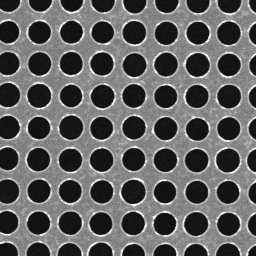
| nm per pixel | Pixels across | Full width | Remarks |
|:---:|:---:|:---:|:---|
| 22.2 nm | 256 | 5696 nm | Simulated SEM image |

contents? a regular array of holes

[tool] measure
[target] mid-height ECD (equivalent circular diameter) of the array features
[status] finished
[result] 524 nanometres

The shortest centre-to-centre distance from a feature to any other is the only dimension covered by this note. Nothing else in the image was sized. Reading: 696 nm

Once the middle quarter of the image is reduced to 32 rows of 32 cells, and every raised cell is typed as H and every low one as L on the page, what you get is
LLLLLHHLLLLLHHLLLLLLLHLLLLLLHHLL
LLLLHHHLLLLLHHHLLLLLHHHLLLLLHHHL
LLLHHHHHLLLHHHHHLLLLHHHHLLLLHHHL
HHHHHHHHHHHHHHHHHHHHHHHHHHHHHHHH
HHHHHHHHHHHHHHHHHHHHHHHHHHHHHHHH
LLLHHHHHLLLHHHHHLLLHHHHHHLHHHHHH
LLLLHHHLLLLLHHHLLLLLHHHLLLLLHHHL
LLLLLHHLLLLLLHHLLLLLHHHLLLLLHHLL
LLLLLHHLLLLLLHHLLLLLHHHLLLLLHHLL
LLLLHHHLLLLLHHHLLLLLHHHLLLLLHHHL
LLLHHHHHLLLHHHHHLLLHHHHHLLLHHHHL
HHHHHHHHHHHHHHHHHHHHHHHHHHHHHHHH
HHHHHHHHHHHHHHHHHHHHHHHHHHHHHHHH
LLLLHHHHLLLHHHHHLLLHHHHHLLLHHHHH
LLLLLHHLLLLLHHHLLLLLHHHLLLLLHHHL
LLLLLHHLLLLLHHHLLLLLHHHLLLLLHHHL
LLLLLHHLLLLLHHHLLLLLHHHLLLLLHHLL
LLLLHHHLLLLLHHHLLLLLHHHLLLLLHHHL
LLLHHHHHLLLHHHHHLLLHHHHHLLLHHHHL
HHHHHHHHHHHHHHHHHHHHHHHHHHHHHHHH
HHHHHHHHHHHHHHHHHHHHHHHHHHHHHHHH
LLLHHHHHLLLHHHHHLLLHHHHHLLLHHHHH
LLLLHHHLLLLLHHHLLLLLHHHLLLLLHHHL
LLLLLHLLLLLLHHHLLLLLHHLLLLLLHHLL
LLLLHHLLLLLLHHHLLLLLHHLLLLLLHHLL
LLLLHHHLLLLLHHHLLLLLHHHLLLLLHHHL
LLLHHHHHLLLHHHHHLLLHHHHLLLLHHHHL
HHHHHHHHHHHHHHHHHHHHHHHHHHHHHHHH
HHHHHHHHHHHHHHHHHHHHHHHHHHHHHHHH
LLLHHHHHLLLHHHHHLLLHHHHHLLLHHHHH
LLLLHHHLLLLLHHHLLLLLHHHLLLLLHHHL
LLLLHHHLLLLLHHLLLLLLLHLLLLLLHHLL